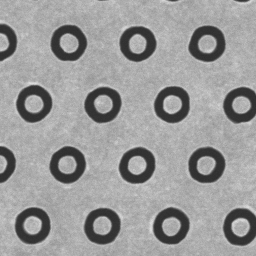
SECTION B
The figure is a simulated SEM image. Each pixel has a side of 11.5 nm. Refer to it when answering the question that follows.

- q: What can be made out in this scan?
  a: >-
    a regular array of ring-shaped grooves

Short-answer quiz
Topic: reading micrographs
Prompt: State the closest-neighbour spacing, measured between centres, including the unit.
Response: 0.793 micrometres